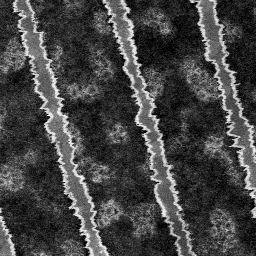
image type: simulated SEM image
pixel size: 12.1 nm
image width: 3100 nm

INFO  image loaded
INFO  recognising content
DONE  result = one or a few lines or trenches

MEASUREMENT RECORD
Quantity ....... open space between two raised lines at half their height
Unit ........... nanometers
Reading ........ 878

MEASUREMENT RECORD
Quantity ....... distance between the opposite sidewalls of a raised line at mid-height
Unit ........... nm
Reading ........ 166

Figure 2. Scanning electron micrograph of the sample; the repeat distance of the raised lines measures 1040 nm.